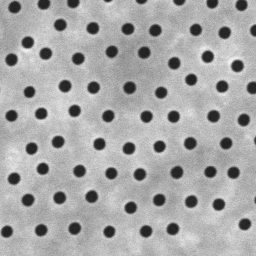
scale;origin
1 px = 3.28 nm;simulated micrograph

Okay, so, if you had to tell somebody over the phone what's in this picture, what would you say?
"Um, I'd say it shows a regular array of holes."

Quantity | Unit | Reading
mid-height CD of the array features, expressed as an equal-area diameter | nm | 39.7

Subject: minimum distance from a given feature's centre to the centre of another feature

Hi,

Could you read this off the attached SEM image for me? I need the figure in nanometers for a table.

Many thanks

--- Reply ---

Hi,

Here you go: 92.3